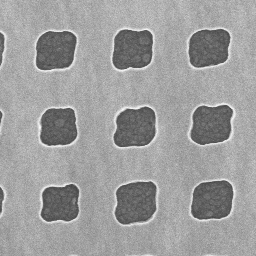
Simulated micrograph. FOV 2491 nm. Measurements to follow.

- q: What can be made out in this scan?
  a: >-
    a regular array of holes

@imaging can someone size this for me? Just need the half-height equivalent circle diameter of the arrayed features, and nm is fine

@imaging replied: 412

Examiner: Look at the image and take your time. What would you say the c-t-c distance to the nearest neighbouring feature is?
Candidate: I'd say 737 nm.